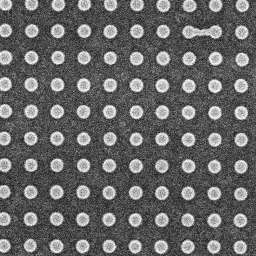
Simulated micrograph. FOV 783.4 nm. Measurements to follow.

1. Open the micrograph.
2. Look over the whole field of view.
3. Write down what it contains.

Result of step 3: a regular array of raised bodies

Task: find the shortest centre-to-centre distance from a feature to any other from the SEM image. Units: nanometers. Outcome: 79.9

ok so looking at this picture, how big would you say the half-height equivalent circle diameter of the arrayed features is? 37.5 nm